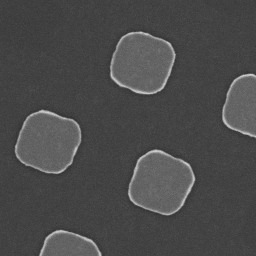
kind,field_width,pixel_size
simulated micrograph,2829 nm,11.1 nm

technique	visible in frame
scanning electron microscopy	raised bodies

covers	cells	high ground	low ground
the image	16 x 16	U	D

DDDDDDDDDDDDDDDD
DDDDDDDDDDDDDDDD
DDDDDDDDUUDDDDDD
DDDDDDDUUUUDDDDD
DDDDDDDUUUUDDDDD
DDDDDDDDUUDDDDUU
DDDDDDDDDDDDDDUU
DDUUDDDDDDDDDDUU
DUUUUDDDDDDDDDDD
DUUUUDDDDUDDDDDD
DDUUDDDDUUUUDDDD
DDDDDDDDUUUUDDDD
DDDDDDDDUUUUDDDD
DDDDDDDDDDDDDDDD
DDDDDDDDDDDDDDDD
DDDUUUDDDDDDDDDD